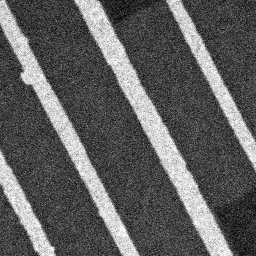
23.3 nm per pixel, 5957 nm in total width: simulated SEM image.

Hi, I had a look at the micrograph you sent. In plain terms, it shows one or a few lines or trenches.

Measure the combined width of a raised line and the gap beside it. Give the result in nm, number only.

1820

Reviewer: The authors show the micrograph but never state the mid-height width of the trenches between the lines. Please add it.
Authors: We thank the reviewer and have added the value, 1450 nanometers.